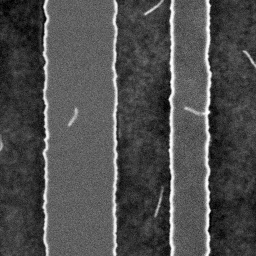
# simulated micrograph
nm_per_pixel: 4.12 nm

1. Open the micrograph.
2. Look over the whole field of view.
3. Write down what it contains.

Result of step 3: lines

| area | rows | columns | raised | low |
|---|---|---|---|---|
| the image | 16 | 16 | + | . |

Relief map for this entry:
...++++....++...
...++++....++...
...++++....++...
...++++....++...
...++++....++...
...++++....++...
...++++....++...
...++++....++...
...++++....++...
...++++....++...
...++++....++...
...++++....++...
...++++....++...
...++++....++...
...++++....++...
...++++....++...